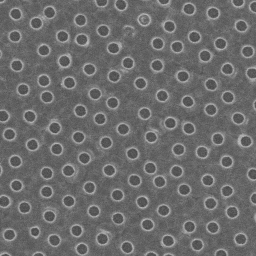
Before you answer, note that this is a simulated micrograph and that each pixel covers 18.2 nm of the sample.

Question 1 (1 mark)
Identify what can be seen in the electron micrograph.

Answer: a regular array of holes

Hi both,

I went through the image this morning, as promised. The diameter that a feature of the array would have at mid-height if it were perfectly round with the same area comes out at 198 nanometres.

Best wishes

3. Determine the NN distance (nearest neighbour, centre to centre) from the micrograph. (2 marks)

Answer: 393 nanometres